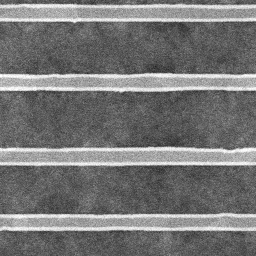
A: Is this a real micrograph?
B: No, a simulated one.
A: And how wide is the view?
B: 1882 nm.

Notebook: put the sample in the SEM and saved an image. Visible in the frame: one or a few lines or trenches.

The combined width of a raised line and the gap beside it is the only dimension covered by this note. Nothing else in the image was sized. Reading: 512 nm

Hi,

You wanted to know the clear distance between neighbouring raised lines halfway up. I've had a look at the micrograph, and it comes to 0.41 micrometres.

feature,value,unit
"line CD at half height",99.2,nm